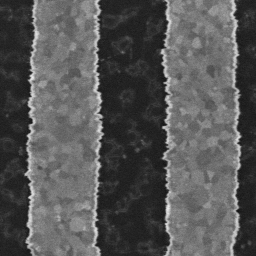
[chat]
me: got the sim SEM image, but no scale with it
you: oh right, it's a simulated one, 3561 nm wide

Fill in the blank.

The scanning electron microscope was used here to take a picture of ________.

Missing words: one or a few lines or trenches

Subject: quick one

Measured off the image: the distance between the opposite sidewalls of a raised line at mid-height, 0.93 µm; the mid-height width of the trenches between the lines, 0.982 um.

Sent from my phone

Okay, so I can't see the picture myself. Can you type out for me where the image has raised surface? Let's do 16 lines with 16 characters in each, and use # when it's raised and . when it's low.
..####....#####.
..####.....####.
..####....#####.
..####....#####.
..####....#####.
..####....#####.
..####....#####.
..####....#####.
..####....#####.
..####....#####.
..####.....####.
..####.....####.
..####.....####.
..####....#####.
..####.....####.
..####.....####.